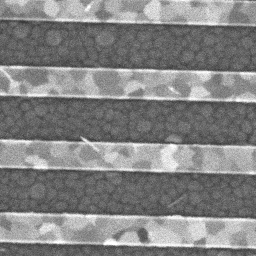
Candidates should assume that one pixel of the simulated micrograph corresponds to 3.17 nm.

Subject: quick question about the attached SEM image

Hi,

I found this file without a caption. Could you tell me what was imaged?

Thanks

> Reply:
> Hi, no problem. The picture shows one or a few lines or trenches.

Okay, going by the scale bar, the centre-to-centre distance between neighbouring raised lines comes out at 0.233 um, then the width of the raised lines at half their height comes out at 87.1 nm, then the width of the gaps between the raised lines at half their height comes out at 147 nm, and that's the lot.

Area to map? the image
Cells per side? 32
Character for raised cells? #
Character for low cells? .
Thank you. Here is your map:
################################
################################
......##########################
................................
................................
................................
................................
................................
#####...........................
################################
################################
################################
............................#..#
................................
................................
................................
................................
................................
################################
################################
################################
..........................######
................................
................................
................................
................................
................................
###############################.
################################
################################
................################
................................